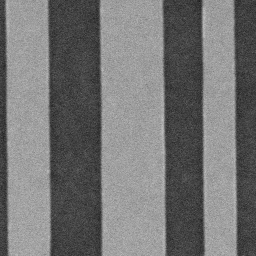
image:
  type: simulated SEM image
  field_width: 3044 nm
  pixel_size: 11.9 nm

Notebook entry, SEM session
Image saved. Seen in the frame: groups of lines, slits or small figures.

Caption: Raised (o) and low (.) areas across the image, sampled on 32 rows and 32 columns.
.ooooo.......ooooooo.....oooo...
.ooooo.......ooooooo.....oooo...
.ooooo.......ooooooo.....oooo...
.ooooo.......ooooooo.....oooo...
.ooooo.......ooooooo.....oooo...
.ooooo.......ooooooo.....oooo...
.ooooo.......ooooooo.....oooo...
.ooooo.......ooooooo.....oooo...
.ooooo.......ooooooo......ooo...
.ooooo.......ooooooo......ooo...
.ooooo.......ooooooo......ooo...
.ooooo.......ooooooo......ooo...
.ooooo.......ooooooo......ooo...
.ooooo.......ooooooo......ooo...
.ooooo.......ooooooo......ooo...
.ooooo.......ooooooo......ooo...
.ooooo.......ooooooo......ooo...
.ooooo.......ooooooo......ooo...
.ooooo.......ooooooo......ooo...
.ooooo.......ooooooo......ooo...
.ooooo.......ooooooo......ooo...
.ooooo.......ooooooo......ooo...
.ooooo.......ooooooo......ooo...
.ooooo.......ooooooo......ooo...
.ooooo.......ooooooo......ooo...
.ooooo.......oooooooo.....ooo...
.ooooo.......oooooooo.....ooo...
.ooooo.......oooooooo.....ooo...
.ooooo.......oooooooo.....ooo...
.ooooo.......oooooooo.....ooo...
.ooooo.......oooooooo.....ooo...
.ooooo.......oooooooo.....oooo..